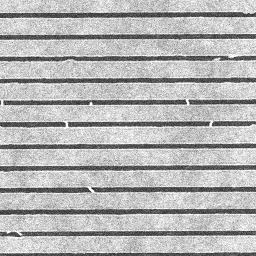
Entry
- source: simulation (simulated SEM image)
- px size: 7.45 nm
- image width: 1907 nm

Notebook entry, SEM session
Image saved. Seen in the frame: parallel lines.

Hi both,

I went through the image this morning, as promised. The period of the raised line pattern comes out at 163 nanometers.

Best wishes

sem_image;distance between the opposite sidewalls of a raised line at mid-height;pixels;16.1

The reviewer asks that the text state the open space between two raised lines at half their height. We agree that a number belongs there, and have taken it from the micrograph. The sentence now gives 40 nm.